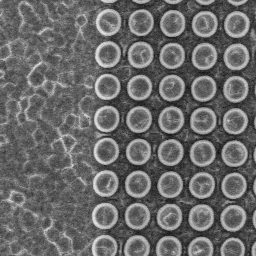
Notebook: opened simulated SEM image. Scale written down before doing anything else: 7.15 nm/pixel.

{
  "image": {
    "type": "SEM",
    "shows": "a regular array of raised bodies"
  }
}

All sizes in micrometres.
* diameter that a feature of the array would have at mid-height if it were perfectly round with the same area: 0.173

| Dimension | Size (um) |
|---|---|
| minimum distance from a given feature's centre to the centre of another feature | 0.229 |